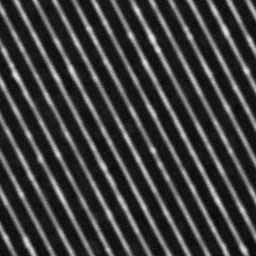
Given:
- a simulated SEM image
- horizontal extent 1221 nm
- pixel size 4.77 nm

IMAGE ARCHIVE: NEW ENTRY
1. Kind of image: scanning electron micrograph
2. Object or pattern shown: parallel lines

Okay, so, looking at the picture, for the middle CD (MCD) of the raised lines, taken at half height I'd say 3.44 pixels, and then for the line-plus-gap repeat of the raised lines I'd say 81.7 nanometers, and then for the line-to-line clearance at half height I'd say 66.1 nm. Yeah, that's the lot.